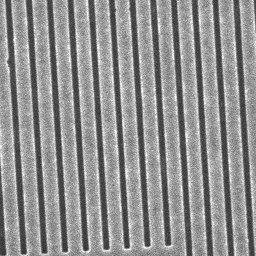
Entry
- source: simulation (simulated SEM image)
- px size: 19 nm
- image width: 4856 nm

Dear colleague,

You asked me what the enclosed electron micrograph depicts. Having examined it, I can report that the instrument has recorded parallel lines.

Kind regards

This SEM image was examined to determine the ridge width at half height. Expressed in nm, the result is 265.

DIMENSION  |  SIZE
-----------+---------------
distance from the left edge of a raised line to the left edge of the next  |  0.393 microns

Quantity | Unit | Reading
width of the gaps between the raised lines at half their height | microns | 0.133